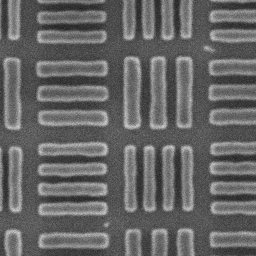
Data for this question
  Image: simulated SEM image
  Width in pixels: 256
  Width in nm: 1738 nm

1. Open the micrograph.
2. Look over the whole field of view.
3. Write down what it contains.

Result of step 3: groups of lines, slits or small figures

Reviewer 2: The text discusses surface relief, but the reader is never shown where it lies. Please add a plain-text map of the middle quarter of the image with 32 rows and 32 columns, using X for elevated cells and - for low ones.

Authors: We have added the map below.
XXXXXXXXXXX----XXXX---XXX---XXXX
XXXXXXXXXXX----XXXX---XXX---XXXX
XXXXXXXXXXX----XXXX---XXX---XXXX
---------------XXXX---XXX---XXXX
---------------XXXX---XXX---XXXX
---------------XXXX---XXX---XXXX
XXXXXXXXXXX----XXXX---XXX---XXXX
XXXXXXXXXXX----XXXX---XXX---XXXX
XXXXXXXXXXX----XXXX---XXX---XXXX
---------------XXXX---XXX---XXXX
---------------XXXX---XXX---XXXX
---------------XXXX---XXX---XXXX
XXXXXXXXXXX----XXXX---XXX---XXXX
XXXXXXXXXXX----XXXX---XXX---XXXX
XXXXXXXXXXX----XXXX---XXX---XXXX
---------------XXXX---XXX---XXXX
--------------------------------
--------------------------------
--------------------------------
--------------------------------
XXXXXXXXXXX-----X---------X-----
XXXXXXXXXXX----XXX--XX---XX--XXX
-X--XXXXXX-----XXX--XX---XX--XXX
---------------XXX--XX---XX---XX
---------------XXX--XX---XX---XX
XXXXXXXXXXX----XXX--XX---XX---XX
XXXXXXXXXXX----XXX--XX---XX---XX
XXXXXXXX-------XXX--XX---XX---XX
---------------XXX--XX---XX---XX
---------------XXX--XXX--XX---XX
XXXXXXXXXXX----XXX--XXX--XX---XX
XXXXXXXXXXX----XXX--XXX--XX---XX